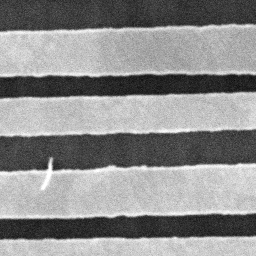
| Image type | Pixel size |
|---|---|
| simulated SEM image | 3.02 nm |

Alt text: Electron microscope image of lines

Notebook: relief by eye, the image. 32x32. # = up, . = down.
................................
................................
................................
...................#############
################################
################################
################################
################################
################################
##..##...#.##...................
................................
................................
################################
################################
################################
################################
#######################.........
................................
................................
................................
................................
...#############################
################################
################################
################################
################################
################################
................................
................................
................................
################################
################################